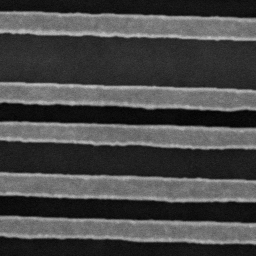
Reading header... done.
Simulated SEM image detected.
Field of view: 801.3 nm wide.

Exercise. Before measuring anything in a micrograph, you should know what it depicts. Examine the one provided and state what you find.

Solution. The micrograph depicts lines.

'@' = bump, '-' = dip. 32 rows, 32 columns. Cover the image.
--------------------------------
--------------------------------
@@@@@@@@@@@@@@@@@@@@@@@@@@@@@@@@
@@@@@@@@@@@@@@@@@@@@@@@@@@@@@@@@
------------@@@@@@@@@@@@@@@@@@@@
--------------------------------
--------------------------------
--------------------------------
--------------------------------
--------------------------------
@@@@@@@@------------------------
@@@@@@@@@@@@@@@@@@@@@@@@@@@@@@@@
@@@@@@@@@@@@@@@@@@@@@@@@@@@@@@@@
-----------------@@@@@@@@@@@@@@@
--------------------------------
@@@@@@@@@@@@@-------------------
@@@@@@@@@@@@@@@@@@@@@@@@@@@@@@@@
@@@@@@@@@@@@@@@@@@@@@@@@@@@@@@@@
----------------------@@@@@@@@@@
--------------------------------
--------------------------------
--------------------------------
@@@@@@@@@@@@@@@@@@@@@@@@@@@@@@@-
@@@@@@@@@@@@@@@@@@@@@@@@@@@@@@@@
---@@@@@@@@@@@@@@@@@@@@@@@@@@@@@
--------------------------------
--------------------------------
@@@@@@@@@@@@@@@@@---------------
@@@@@@@@@@@@@@@@@@@@@@@@@@@@@@@@
@@@@@@@@@@@@@@@@@@@@@@@@@@@@@@@@
---------------------------@---@
--------------------------------